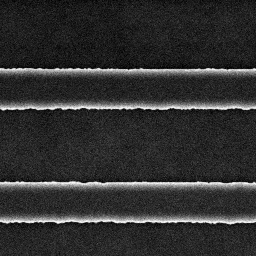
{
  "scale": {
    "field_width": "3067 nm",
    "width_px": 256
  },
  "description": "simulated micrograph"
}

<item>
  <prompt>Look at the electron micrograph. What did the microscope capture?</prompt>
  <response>lines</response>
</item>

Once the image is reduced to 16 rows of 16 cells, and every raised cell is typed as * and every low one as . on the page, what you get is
................
................
................
................
****************
****************
****************
................
................
................
................
****************
****************
****************
................
................